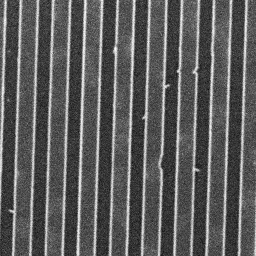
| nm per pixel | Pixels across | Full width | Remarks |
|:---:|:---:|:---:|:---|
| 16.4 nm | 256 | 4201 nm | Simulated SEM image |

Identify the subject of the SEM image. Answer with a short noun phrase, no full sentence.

parallel lines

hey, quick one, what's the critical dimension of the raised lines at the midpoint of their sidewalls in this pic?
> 289 nm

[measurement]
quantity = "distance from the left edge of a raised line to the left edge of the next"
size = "0.528 micrometres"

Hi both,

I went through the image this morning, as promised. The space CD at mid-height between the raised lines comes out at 236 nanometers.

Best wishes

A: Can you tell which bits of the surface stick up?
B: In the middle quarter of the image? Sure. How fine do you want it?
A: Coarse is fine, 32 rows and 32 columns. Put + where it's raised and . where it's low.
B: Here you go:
+....++++....++++....++++....+++
+....++++....++++....++++....+++
+....++++....++++....++++....+++
+....++++....++++....++++....+++
+....++++....++++....++++....+++
+....++++....++++....+++++...+++
+....++++....++++....++++....+++
+....++++....++++....++++....+++
+....++++....++++....++++....+++
+....++++....++++....++++....+++
+...+++++...+++++....++++....+++
+...+++++....++++....++++....+++
+...+++++....++++...+++++....+++
+...+++++....++++...+++++....+++
+...+++++....++++....++++....+++
+...+++++....++++....++++....+++
....++++.....++++....++++....+++
....++++....++++....+++++...++++
....++++....++++....+++++...++++
....++++....++++....+++++...++++
....++++....++++....+++++...++++
....++++....++++....+++++...++++
....++++....++++....+++++...++++
....++++....++++....++++....++++
....++++....++++....++++....++++
....++++....++++....++++....++++
....++++....++++....++++....++++
....++++....++++....++++....++++
....++++....++++....++++....++++
....++++....++++....++++....++++
....++++....++++....++++....++++
....++++....++++....++++....++++